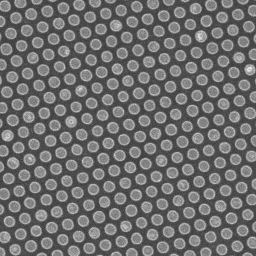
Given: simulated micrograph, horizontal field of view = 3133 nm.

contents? a regular array of raised bodies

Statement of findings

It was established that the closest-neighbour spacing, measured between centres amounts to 194 nm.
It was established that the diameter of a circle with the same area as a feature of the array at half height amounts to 11.3 pixels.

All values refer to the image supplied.